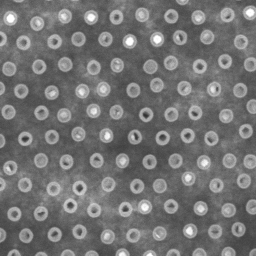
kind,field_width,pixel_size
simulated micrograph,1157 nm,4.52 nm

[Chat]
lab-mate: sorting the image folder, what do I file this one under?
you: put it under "a regular array of raised bodies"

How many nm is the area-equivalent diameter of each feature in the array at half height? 59.9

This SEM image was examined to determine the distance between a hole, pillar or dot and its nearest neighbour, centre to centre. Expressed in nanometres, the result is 110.